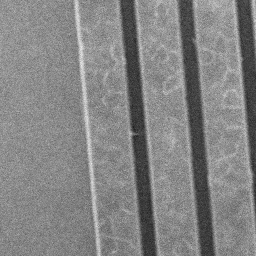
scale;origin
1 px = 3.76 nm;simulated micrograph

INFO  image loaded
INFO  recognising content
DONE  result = parallel lines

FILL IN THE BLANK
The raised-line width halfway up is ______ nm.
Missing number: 159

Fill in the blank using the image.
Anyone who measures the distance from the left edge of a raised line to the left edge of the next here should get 0.219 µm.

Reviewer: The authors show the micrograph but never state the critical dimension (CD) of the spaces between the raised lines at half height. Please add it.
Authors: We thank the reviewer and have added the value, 58 nm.